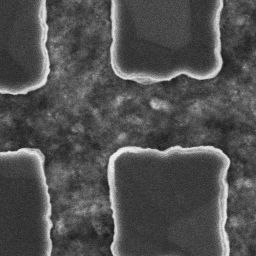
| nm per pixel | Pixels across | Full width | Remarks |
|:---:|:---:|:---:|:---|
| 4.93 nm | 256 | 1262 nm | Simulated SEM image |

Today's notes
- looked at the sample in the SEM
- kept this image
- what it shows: raised bodies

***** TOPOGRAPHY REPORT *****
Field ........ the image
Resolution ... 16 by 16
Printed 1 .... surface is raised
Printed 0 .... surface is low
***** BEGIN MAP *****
1110000111111100
1110000111111100
1110000111111100
1110000111111100
1110000111111000
1100000000000000
0000000000000000
0000000000000000
0000000000000000
0100000111111100
1110000111111100
1110000111111100
1110000111111100
1110000111111100
1110000111111100
1110000111111100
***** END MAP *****